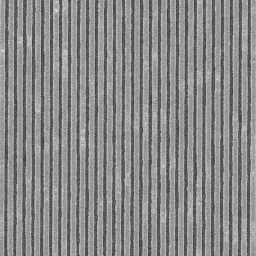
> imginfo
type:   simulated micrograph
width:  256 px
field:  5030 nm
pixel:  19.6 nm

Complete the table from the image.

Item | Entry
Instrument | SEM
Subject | parallel lines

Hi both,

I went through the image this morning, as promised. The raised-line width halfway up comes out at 106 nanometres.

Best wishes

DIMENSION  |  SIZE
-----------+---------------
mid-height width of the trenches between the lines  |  71.2 nanometers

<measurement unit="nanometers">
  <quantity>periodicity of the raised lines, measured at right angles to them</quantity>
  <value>176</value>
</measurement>